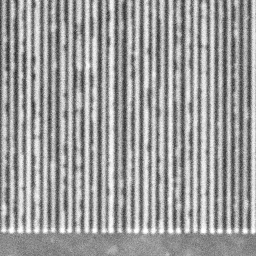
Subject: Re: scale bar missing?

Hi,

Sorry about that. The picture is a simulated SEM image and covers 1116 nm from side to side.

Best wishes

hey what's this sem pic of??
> parallel lines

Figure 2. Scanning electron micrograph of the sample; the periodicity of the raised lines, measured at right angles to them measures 0.0363 um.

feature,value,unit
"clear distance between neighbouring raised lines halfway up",5.76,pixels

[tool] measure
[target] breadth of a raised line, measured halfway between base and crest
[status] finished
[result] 0.0125 µm